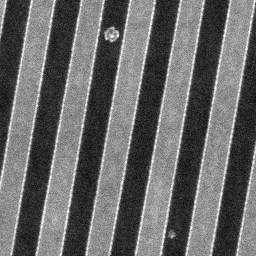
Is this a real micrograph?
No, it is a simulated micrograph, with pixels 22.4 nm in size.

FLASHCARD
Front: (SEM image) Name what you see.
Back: lines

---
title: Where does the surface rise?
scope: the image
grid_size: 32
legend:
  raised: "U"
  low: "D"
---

DUUUDDDUUUDDDUUUDDDUUUUDDUUUUDDD
UUUUDDDUUUDDDUUUDDDUUUDDDUUUUDDD
UUUUDDUUUUDDDUUUDDDUUUDDDUUUDDDU
UUUDDDUUUUDDUUUUDDDUUUDDDUUUDDDU
UUUDDDUUUDDDUUUUDDDUUUDDDUUUDDDU
UUUDDDUUUDDDUUUDDDUUUUDDUUUUDDDU
UUUDDDUUUDDDUUUDDDUUUUDDUUUUDDDU
UUUDDDUUUDDDUUUDDDUUUDDDUUUUDDDU
UUUDDUUUUDDDUUUDDDUUUDDDUUUDDDUU
UUDDDUUUUDDUUUUDDDUUUDDDUUUDDDUU
UUDDDUUUDDDUUUUDDUUUUDDDUUUDDDUU
UUDDDUUUDDDUUUDDDUUUUDDUUUUDDDUU
UUDDDUUUDDDUUUDDDUUUDDDUUUUDDDUU
UUDDDUUUDDDUUUDDDUUUDDDUUUUDDUUU
UUDDUUUUDDDUUUDDDUUUDDDUUUDDDUUU
UDDDUUUDDDUUUUDDDUUUDDDUUUDDDUUU
UDDDUUUDDDUUUDDDUUUUDDDUUUDDDUUU
UDDDUUUDDDUUUDDDUUUUDDUUUUDDDUUU
UDDDUUUDDDUUUDDDUUUDDDUUUUDDDUUU
UDDUUUUDDDUUUDDDUUUDDDUUUDDDUUUU
DDDUUUUDDDUUUDDDUUUDDDUUUDDDUUUU
DDDUUUDDDUUUUDDUUUUDDDUUUDDDUUUD
DDDUUUDDDUUUDDDUUUUDDDUUUDDDUUUD
DDDUUUDDDUUUDDDUUUUDDUUUUDDDUUUD
DDDUUUDDDUUUDDDUUUDDDUUUUDDDUUUD
DDUUUUDDDUUUDDDUUUDDDUUUDDDUUUUD
DDUUUUDDUUUUDDDUUUDDDUUUDDDUUUUD
DDUUUDDDUUUUDDUUUUDDDUUUDDDUUUDD
DDUUUDDDUUUDDDUUUUDDDUUUDDDUUUDD
DDUUUDDDUUUDDDUUUDDDUUUUDDDUUUDD
DDUUUDDDUUUDDDUUUDDDUUUUDDDUUUDD
DUUUUDDDUUUDDDUUUDDDUUUDDDUUUUDD